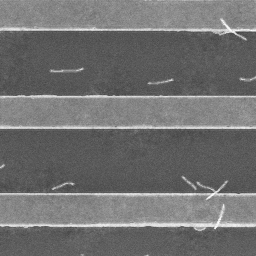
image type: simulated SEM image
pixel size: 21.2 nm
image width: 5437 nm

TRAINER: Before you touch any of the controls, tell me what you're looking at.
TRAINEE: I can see lines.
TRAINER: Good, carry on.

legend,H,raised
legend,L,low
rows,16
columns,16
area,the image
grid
HHHHHHHHHHHHHHHH
HHHHHHHHHHHHHHHH
LLLLLLLLLLLLLLLL
LLLLLLLLLLLLLLLL
LLLLLLLLLLLLLLLL
LLLLLLLLLLLLLLLL
HHHHHHHHHHHHHHHH
HHHHHHHHHHHHHHHH
LLLLLLLLLLLLLLLL
LLLLLLLLLLLLLLLL
LLLLLLLLLLLLLLLL
LLLLLLLLLLLLLLLL
HHHHHHHHHHHHHHHH
HHHHHHHHHHHHHHHH
LLLLLLLLLLLLLLLL
LLLLLLLLLLLLLLLL